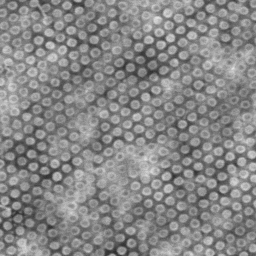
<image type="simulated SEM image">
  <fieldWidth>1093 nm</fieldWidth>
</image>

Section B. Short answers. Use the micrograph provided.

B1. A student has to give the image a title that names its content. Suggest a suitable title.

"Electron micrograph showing a regular array of raised bodies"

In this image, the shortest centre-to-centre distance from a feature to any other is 51.5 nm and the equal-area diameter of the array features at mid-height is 35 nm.